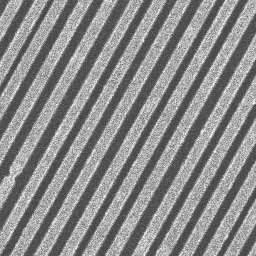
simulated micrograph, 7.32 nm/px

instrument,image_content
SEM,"parallel lines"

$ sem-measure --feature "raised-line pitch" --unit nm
154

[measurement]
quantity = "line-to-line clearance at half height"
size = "60.6 nm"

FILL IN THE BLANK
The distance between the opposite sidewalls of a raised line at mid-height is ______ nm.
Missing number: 94.1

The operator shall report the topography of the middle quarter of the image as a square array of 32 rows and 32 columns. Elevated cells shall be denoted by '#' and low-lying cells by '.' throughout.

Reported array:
.###...####..####..####..####..#
####...###..####...###...###..##
###...####..###...####..####..##
##...####..####..####...###..###
##...####..###...###...####..###
#...####..####..####...###..####
#...###...###...###...###...###.
....###..####..####...###..####.
...###...###..####...###...###..
..####..###...####..####..####..
..###..####..####...###..####..#
.####..###...####..####..###...#
.###..####..####...###..####..##
###...###...###...####..###...##
###..####..####...###..####..###
##...###...###...###...###..####
##..####..####..####..####..###.
#..####...###...###..####..####.
#..###...###...####..####..###..
..####..####...###..####..####..
..###...###...####..###...###...
.####..####...###..####..####...
.###...###...###...###...###...#
###...####...###..####..####...#
###...###...###...###..####...##
##...####..####..####..###...###
##...###...###..####..####...###
#...###...####..###...###...####
#..####...###..####..####...###.
...###...####..###...###...####.
..####...###..####..####...###..
..###...###...###..####...####..